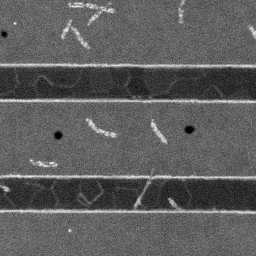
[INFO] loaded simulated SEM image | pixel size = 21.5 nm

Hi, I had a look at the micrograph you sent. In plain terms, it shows lines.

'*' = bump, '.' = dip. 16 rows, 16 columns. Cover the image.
................
................
................
................
****************
****************
................
................
................
................
................
****************
****************
................
................
................